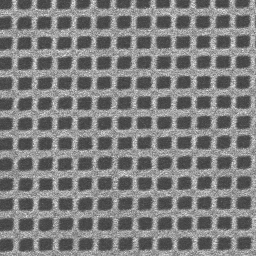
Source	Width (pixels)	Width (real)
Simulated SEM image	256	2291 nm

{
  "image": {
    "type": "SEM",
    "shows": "a regular array of holes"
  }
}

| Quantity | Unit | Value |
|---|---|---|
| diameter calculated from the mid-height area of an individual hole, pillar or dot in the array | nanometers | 137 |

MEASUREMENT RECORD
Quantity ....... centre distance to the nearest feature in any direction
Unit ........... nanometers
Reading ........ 176